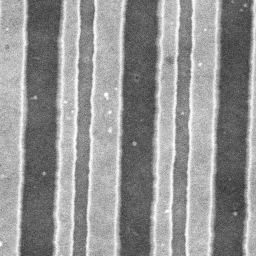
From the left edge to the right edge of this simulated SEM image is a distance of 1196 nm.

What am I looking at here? lines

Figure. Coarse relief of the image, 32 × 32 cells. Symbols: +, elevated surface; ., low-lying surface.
+++.....+++++++.....+++++++.....
+++.....+++++++.....+++++++.....
+++.....+++++++.....+++++++.....
+++.....+++++++.....+++++++.....
+++.....+++++++.....+++++++.....
+++.....+++++++.....+++++++.....
+++.....+++++++.....+++++++.....
+++.....+++++++.....+++++++.....
+++.....+++++++.....+++++++.....
+++.....+++++++.....+++++++.....
+++.....+++++++.....+++++++....+
+++.....+++++++.....+++++++....+
+++.....+++++++.....+++++++....+
+++.....+++++++.....+++++++....+
+++.....+++++++.....+++++++....+
+++.....+++++++.....+++++++....+
+++.....+++++++.....+++++++....+
+++....++++++++.....+++++++....+
+++....++++++++.....+++++++....+
+++....++++++++.....+++++++....+
+++.....+++++++.....+++++++....+
+++....++++++++.....+++++++....+
+++....++++++++.....++++++.....+
+++....++++++++.....++++++.....+
+++....++++++++.....++++++.....+
++.....++++++++....+++++++.....+
++.....++++++++....+++++++.....+
++.....++++++++....+++++++.....+
++.....++++++++....+++++++.....+
++.....+++++++.....+++++++.....+
++.....++++++++....+++++++.....+
++.....++++++++....+++++++.....+